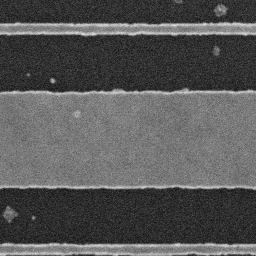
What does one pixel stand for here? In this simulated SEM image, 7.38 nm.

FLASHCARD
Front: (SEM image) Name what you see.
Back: lines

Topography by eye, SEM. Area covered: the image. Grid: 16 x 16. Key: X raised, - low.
----------------
--------------X-
----------------
----------------
----------------
----------------
XXXXXXXXXXXXXXXX
XXXXXXXXXXXXXXXX
XXXXXXXXXXXXXXXX
XXXXXXXXXXXXXXXX
XXXXXXXXXXXXXXXX
XXXXXXXXXXXXXXXX
----------------
----------------
----------------
XXXXXXXXXXXXXXXX